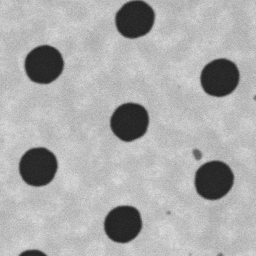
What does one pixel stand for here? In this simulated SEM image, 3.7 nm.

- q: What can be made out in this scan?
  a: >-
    holes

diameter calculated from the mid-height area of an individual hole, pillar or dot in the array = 0.143 micrometres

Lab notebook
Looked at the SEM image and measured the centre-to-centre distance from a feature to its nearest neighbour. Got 0.373 micrometres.